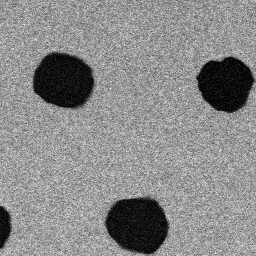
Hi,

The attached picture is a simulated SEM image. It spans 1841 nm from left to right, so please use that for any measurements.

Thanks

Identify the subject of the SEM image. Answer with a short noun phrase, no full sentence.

holes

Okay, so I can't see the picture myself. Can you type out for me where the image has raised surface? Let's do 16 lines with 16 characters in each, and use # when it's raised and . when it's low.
################
################
################
###.############
##....######....
##....######....
###..########..#
################
################
################
################
################
########..######
.######...######
.######...######
########..######